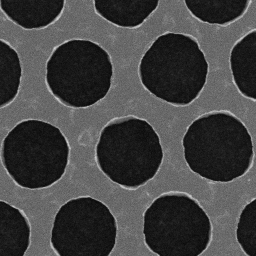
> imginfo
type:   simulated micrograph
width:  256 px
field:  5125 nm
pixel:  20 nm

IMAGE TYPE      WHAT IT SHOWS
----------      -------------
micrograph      holes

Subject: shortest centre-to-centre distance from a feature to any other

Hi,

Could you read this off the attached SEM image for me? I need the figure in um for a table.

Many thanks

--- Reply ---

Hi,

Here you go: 1.8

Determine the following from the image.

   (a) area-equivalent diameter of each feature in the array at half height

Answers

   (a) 1360 nm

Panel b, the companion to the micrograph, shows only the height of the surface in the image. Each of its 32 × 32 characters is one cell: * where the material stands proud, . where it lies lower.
........****........***........*
*.......****.......*****......**
**.....******.....*******....***
***..***************************
********************...********.
.*******....*******......*****..
..*****......*****.......****...
..****........****........***...
...***........***.........***...
...***........***.........***...
..****........****........***...
..*****......******......*****..
..*****.....********....********
********************************
*************************....***
**....********.....*****......**
*.......*****......****........*
*.......****........***........*
.........***........***.........
........****........***.........
........****........***........*
*.......*****.......****.......*
**.....*******.....*******...***
***..***************************
********************...*********
.*******.....******......******.
..*****.......****........****..
...****.......****........****..
....***........***........****..
....**........****........****..
....***.......****........****..
...****.......*****......******.